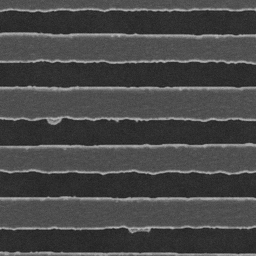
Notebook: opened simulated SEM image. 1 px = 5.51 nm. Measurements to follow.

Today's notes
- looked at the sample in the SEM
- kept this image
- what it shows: lines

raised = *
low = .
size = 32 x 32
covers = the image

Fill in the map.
********************************
................................
................................
................................
********************************
********************************
********************************
********************************
................................
................................
................................
********************************
********************************
********************************
********************************
................................
................................
................................
********************************
********************************
********************************
.*...**********..****.**.*******
................................
................................
................................
********************************
********************************
********************************
*************...***..*..........
................................
................................
................................